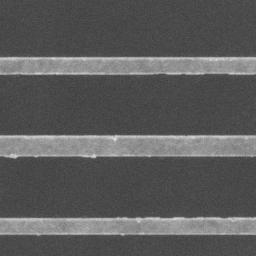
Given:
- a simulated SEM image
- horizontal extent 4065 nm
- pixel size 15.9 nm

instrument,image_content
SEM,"lines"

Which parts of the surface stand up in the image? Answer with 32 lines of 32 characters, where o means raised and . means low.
................................
................................
................................
................................
................................
................................
................................
oooooooooooooooooooooooooooooooo
oooooooooooooooooooooooooooooooo
................................
................................
................................
................................
................................
................................
................................
................................
oooooooooooooooooooooooooooooooo
oooooooooooooooooooooooooooooooo
ooo.o.....oo....................
................................
................................
................................
................................
................................
................................
................................
oooooooooooooooooooooooooooooooo
oooooooooooooooooooooooooooooooo
................................
................................
................................